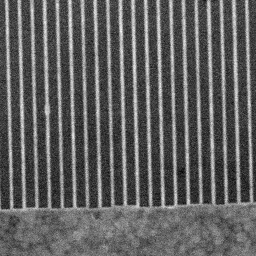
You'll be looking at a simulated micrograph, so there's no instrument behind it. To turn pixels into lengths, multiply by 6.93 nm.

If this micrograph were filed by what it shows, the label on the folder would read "parallel lines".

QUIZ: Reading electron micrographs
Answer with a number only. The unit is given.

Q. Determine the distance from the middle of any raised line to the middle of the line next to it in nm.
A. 87.5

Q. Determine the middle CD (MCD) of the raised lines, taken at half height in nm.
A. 19.1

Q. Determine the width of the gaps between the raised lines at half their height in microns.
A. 0.0701